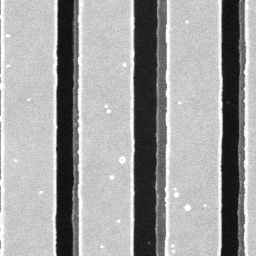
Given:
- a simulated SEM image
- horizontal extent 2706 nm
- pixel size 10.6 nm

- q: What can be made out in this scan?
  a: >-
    lines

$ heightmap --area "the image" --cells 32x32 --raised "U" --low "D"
UUUUUUUDDUUUUUUUUDDDUUUUUUUUDDUU
UUUUUUUDDUUUUUUUUDDDUUUUUUUUDDUU
UUUUUUUDDUUUUUUUUDDDUUUUUUUUDDUU
UUUUUUUDDUUUUUUUUDDDUUUUUUUUDDUU
UUUUUUUDDUUUUUUUUDDDUUUUUUUUDDUU
UUUUUUUDDUUUUUUUUDDDUUUUUUUUDDUU
UUUUUUUDDUUUUUUUUDDDUUUUUUUUDDUU
UUUUUUUDDUUUUUUUUDDDUUUUUUUUDDUU
UUUUUUUDDUUUUUUUUDDDUUUUUUUUDDUU
UUUUUUUDDUUUUUUUUDDDUUUUUUUUDDUU
UUUUUUUDDUUUUUUUUDDDUUUUUUUUDDUU
UUUUUUUDDUUUUUUUUDDDUUUUUUUUDDUU
UUUUUUUDDUUUUUUUUDDDUUUUUUUUDDUU
UUUUUUUDDUUUUUUUUDDDUUUUUUUUDDUU
UUUUUUUDDUUUUUUUUDDDUUUUUUUUDDUU
UUUUUUUDDUUUUUUUUDDDUUUUUUUUDDUU
UUUUUUUDDUUUUUUUUDDDUUUUUUUUDDUU
UUUUUUUDDUUUUUUUUDDDUUUUUUUUDDUU
UUUUUUUDDUUUUUUUUDDDUUUUUUUUDDUU
UUUUUUUDDUUUUUUUUDDDUUUUUUUUDDUU
UUUUUUUDDUUUUUUUUDDDUUUUUUUUDDUU
UUUUUUUDDUUUUUUUUDDDUUUUUUUUDDUU
UUUUUUUDDUUUUUUUUDDDUUUUUUUUDDUU
UUUUUUUDDUUUUUUUUDDUUUUUUUUUDDUU
UUUUUUUDDUUUUUUUUDDDUUUUUUUUDDUU
UUUUUUUDDUUUUUUUUDDDUUUUUUUUDDUU
UUUUUUUDDUUUUUUUUDDDUUUUUUUUDDUU
UUUUUUUDDUUUUUUUUDDDUUUUUUUUDDUU
UUUUUUUDDUUUUUUUUDDUUUUUUUUUDDUU
UUUUUUUDDUUUUUUUUDDDUUUUUUUUDDUU
UUUUUUUDDUUUUUUUUDDDUUUUUUUUDDUU
UUUUUUUDDUUUUUUUUDDDUUUUUUUUDDUU